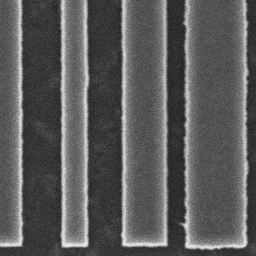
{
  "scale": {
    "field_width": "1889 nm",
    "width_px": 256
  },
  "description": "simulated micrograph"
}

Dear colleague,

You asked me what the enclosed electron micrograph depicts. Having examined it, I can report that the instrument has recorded one or a few lines or trenches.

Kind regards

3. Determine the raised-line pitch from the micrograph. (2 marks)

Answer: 0.521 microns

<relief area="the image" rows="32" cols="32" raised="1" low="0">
11100000111000011111100111111110
11100000111000011111100111111110
11100000111000011111100111111110
11100000111000011111100111111110
11100000111000011111100111111110
11100000111000011111100111111110
11100000111000011111100111111110
11100000111000011111100111111110
11100000111000011111100111111110
11100000111000011111100111111110
11100000111000011111100111111110
11100000111000011111100111111110
11100000111000011111100111111110
11100000111000011111100111111110
11100000111000011111100111111110
11100000111000011111100111111110
11100000111000011111100111111110
11100000111000011111100111111110
11100000111000011111100111111110
11100000111000011111100111111110
11100000111000011111100111111110
11100000111000011111100111111110
11100000111000011111100111111110
11100000111000011111100111111110
11100000111000001111100111111110
11100000111000011111100111111110
11100000111000001111100111111110
11100000111000011111100111111110
11100000111000011111100111111110
11100000111000011111100111111110
11000000111000001111000111111110
00000000000000000000000000000000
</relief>